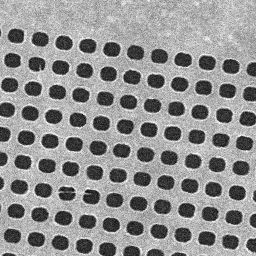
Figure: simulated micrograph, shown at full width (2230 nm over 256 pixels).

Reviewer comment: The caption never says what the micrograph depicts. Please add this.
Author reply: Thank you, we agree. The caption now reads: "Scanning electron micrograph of a regular array of holes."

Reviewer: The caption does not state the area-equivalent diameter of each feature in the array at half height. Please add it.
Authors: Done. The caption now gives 143 nanometers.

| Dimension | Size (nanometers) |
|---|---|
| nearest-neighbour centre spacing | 209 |